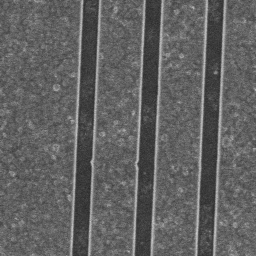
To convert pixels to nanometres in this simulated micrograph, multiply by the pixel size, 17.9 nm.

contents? parallel lines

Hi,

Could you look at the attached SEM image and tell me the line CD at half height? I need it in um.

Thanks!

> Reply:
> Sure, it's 0.82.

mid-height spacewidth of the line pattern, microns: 0.296